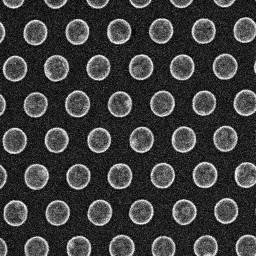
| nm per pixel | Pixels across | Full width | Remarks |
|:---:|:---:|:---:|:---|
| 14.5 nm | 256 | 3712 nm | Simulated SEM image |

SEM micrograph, a regular array of raised bodies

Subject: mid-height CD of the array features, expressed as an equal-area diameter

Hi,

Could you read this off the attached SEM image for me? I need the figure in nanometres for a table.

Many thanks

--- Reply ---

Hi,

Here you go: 349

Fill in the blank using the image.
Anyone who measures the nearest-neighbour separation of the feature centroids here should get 601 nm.